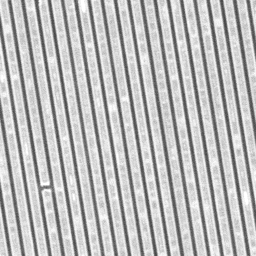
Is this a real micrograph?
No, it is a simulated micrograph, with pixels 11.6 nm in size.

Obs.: parallel lines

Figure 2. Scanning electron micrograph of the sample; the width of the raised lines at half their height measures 98.9 nm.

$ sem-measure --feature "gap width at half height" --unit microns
0.0559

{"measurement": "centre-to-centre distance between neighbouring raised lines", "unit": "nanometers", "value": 152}